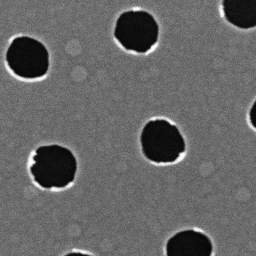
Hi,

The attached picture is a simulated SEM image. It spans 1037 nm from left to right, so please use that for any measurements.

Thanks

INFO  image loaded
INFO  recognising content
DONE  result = holes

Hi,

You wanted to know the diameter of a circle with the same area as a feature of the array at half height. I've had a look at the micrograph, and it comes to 173 nanometres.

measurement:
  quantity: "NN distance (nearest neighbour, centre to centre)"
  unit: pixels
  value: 111